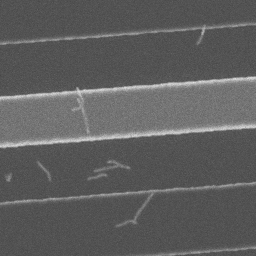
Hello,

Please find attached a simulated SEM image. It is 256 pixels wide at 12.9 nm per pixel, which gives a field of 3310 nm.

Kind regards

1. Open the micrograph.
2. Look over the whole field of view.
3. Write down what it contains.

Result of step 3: lines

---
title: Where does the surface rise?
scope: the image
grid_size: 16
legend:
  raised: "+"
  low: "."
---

++++++++++++++++
++++++++++++++++
++++............
................
................
.......+++++++++
++++++++++++++++
++++++++++++++++
++++++++........
................
................
...............+
..++++++++++++++
++++++++++++++++
++++++++++++++++
++++++++++++++++